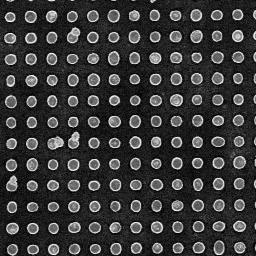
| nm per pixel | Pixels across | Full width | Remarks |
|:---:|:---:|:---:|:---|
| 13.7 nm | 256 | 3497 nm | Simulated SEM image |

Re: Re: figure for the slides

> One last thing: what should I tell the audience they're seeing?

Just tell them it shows a regular array of raised bodies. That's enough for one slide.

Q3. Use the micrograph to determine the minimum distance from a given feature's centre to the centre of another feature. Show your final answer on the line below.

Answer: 280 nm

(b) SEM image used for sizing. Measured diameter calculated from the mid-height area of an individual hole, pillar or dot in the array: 140 nanometers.